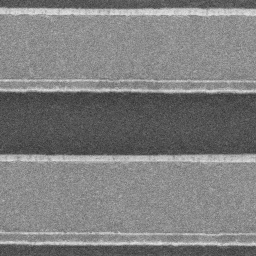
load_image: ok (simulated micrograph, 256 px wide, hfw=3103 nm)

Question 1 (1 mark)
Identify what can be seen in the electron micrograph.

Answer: lines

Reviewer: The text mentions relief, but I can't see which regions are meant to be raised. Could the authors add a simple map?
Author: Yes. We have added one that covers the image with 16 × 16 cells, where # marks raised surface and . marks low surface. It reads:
................
################
################
################
################
################
................
................
................
................
################
################
################
################
################
................